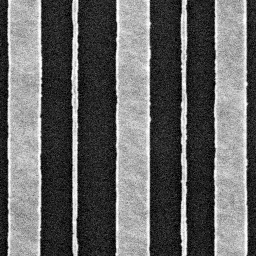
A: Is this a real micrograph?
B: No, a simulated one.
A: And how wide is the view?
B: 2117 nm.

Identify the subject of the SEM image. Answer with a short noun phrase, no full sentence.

lines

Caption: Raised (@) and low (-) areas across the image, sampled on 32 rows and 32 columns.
-@@@@----@-----@@@@--------@@@@-
-@@@@----@-----@@@@--------@@@@-
-@@@@----------@@@@--------@@@@-
-@@@@----------@@@@--------@@@@-
-@@@@----------@@@@--------@@@@-
-@@@@----@-----@@@@--------@@@@-
-@@@@----------@@@@--------@@@@-
-@@@@----@-----@@@@--------@@@@-
-@@@@----@-----@@@@--------@@@@-
-@@@@----@-----@@@@--------@@@@-
-@@@@----@-----@@@@--------@@@@-
-@@@@----@-----@@@@--------@@@@-
-@@@@----@-----@@@@--------@@@@-
-@@@@----@-----@@@@--------@@@@-
-@@@@----------@@@@--------@@@@-
-@@@@----------@@@@--------@@@@-
-@@@@----------@@@@--------@@@@-
-@@@@----------@@@@--------@@@@-
-@@@@----------@@@@--------@@@@-
-@@@@----------@@@@--------@@@@-
-@@@@----------@@@@--------@@@@-
-@@@@----------@@@@--------@@@@-
-@@@@----------@@@@--------@@@@-
-@@@@----------@@@@--------@@@@-
-@@@@----------@@@@--------@@@@-
-@@@@----------@@@@--------@@@@-
-@@@@----------@@@@--------@@@@-
-@@@@----------@@@@--------@@@@-
-@@@@----------@@@@--------@@@@-
-@@@@----------@@@@--------@@@@-
-@@@@----------@@@@--------@@@@-
-@@@@----------@@@@--------@@@@-